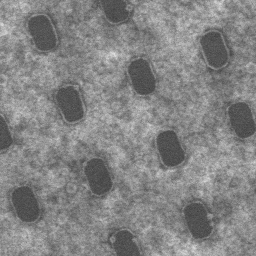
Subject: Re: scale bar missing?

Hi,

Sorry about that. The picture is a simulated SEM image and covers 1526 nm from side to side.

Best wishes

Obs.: a regular array of raised bodies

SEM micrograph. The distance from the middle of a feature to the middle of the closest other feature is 0.459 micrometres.